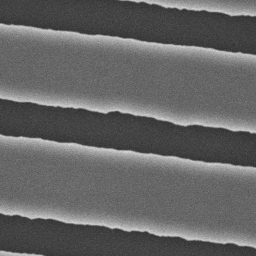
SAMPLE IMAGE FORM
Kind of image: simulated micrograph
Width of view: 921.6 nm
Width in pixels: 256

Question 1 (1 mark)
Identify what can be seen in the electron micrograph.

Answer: lines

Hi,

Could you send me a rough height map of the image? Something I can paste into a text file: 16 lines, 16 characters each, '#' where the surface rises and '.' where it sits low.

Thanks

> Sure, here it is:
...........#####
................
#########.......
################
################
################
..##############
..........######
#...............
#########.......
################
################
################
.###############
.........#######
................